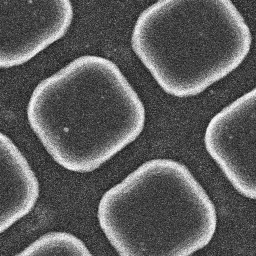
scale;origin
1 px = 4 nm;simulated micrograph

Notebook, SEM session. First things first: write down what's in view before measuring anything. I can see raised bodies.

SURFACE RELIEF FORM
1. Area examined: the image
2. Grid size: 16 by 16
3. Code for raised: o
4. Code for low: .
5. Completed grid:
oooo......oooo..
oooo.....oooooo.
ooo.....ooooooo.
oo.......oooooo.
....ooo...oooo..
...ooooo..oo....
..ooooooo......o
..ooooooo....ooo
...ooooo.....ooo
o..oooo......ooo
oo.......oo...oo
oo......oooo...o
oo.....oooooo...
o.....ooooooo...
.......oooooo...
..ooo..ooooo....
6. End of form